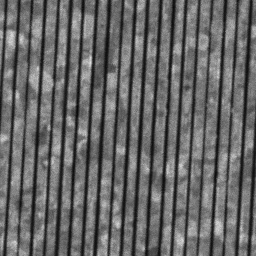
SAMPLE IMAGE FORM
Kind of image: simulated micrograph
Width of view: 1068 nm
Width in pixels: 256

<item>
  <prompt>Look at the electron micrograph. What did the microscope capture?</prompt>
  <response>parallel lines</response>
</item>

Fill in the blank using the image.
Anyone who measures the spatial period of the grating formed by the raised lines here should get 0.0535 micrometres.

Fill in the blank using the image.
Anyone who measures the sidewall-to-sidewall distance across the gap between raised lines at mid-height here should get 14.6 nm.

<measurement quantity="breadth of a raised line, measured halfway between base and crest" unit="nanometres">39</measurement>